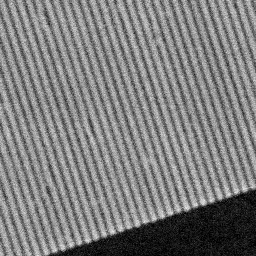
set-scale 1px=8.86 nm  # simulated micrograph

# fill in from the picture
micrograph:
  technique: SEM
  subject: parallel lines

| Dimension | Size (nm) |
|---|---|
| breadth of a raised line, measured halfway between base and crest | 49.6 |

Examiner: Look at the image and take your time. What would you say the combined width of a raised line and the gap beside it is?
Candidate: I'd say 76.8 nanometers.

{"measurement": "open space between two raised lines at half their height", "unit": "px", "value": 2.74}